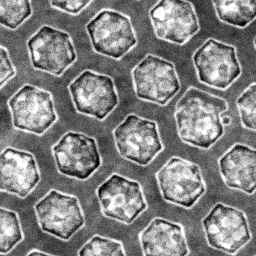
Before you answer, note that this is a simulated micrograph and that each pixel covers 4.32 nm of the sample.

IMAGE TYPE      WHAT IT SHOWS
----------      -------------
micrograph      a regular array of holes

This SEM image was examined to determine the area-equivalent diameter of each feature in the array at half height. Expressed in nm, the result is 197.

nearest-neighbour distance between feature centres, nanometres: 264